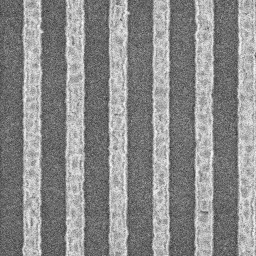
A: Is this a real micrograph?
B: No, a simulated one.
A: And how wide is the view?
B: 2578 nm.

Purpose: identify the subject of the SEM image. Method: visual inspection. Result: parallel lines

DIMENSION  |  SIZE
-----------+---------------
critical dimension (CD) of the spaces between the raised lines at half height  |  266 nm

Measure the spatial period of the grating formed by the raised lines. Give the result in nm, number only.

433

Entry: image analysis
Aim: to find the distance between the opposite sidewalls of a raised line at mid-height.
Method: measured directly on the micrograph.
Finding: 171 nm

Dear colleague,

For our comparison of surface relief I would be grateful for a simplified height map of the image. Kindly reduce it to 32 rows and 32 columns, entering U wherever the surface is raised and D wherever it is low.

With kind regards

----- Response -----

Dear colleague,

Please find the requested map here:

DDDUUDDDUUDDDDUUDDDUUDDDUUUDDDUU
DDDUUDDDUUUDDDUUDDDUUDDDDUUDDDUU
DDDUUDDDUUDDDDUUDDDUUDDDUUUDDDUU
DDDUUDDDUUUDDDUUDDDUUDDDDUUDDDUU
DDDUUDDDUUUDDDUUDDDUUDDDUUUDDDUU
DDDUUDDDUUUDDDUUDDDUUDDDDUUDDDUU
DDDUUDDDUUDDDDUUDDDUUDDDUUUDDDUU
DDDUUDDDUUDDDDUUDDDUUDDDUUUDDDUU
DDDUUDDDDUUDDDUUDDDUUDDDDUUDDDUU
DDDUUDDDUUUDDDUUDDDUUDDDUUUDDDUU
DDDUUDDDUUDDDDUUDDDUUDDDUUUDDDUU
DDDUUDDDUUDDDDUUDDDUUDDDDUDDDDUU
DDDUUDDDUUDDDDUUDDDUUDDDDUDDDDUU
DDDUUDDDUUDDDDUUDDDUUDDDUUDDDDUU
DDDUUDDDUUDDDDUUDDDUUDDDUUUDDDUU
DDDUUDDDUUDDDDUUDDDUUDDDUUUDDDUU
DDDUUDDDUUDDDDUUDDDUUDDDUUUDDDUU
DDDUUDDDUUDDDDUUDDDUUDDDDUUDDDUU
DDDUUDDDUUDDDDUUDDDUUDDDDUUDDDUU
DDDUUDDDUUUDDDUUDDDUUDDDUUUDDDUU
DDDUUDDDUUDDDDUUDDDUUDDDUUUDDDUU
DDDUUDDDUUDDDDUUDDDUUDDDDUUDDDUU
DDDUUDDDUUDDDDUUDDDUUDDDUUUDDDUU
DDDUUDDDUUDDDDUUDDDUUDDDUUUDDDUU
DDDUUDDDUUDDDDUUDDDUUDDDUUUDDDUU
DDDUUDDDUUDDDDUUDDDUUDDDDUUDDDUU
DDDUUDDDUUDDDDUUDDDUUDDDUUUDDDUU
DDDUUDDDUUUDDDUUDDDUUDDDUUUDDDUU
DDDUUDDDUUDDDDUUDDDUUDDDUUUDDDUU
DDDUUDDDUUDDDDUUDDDUUDDDUUUDDDUU
DDDUUDDDUUDDDDUUDDDUUDDDUUUDDDUU
DDDUUDDDUUDDDDUUDDDUUDDDUUUDDDUU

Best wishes